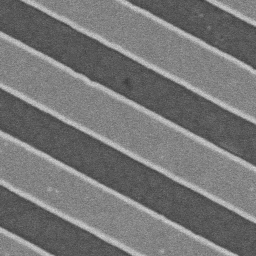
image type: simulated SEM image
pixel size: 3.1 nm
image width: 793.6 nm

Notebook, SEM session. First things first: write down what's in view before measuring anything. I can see one or a few lines or trenches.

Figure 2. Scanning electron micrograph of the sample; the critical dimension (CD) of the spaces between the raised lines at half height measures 0.131 um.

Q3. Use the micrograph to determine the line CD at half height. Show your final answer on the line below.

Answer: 140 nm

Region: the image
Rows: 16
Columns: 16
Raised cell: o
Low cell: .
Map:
...ooooo......oo
....oooooo......
o.....oooooo....
ooo.....oooooo..
oooo......oooooo
oooooo......oooo
..oooooo......oo
....oooooo......
......oooooo....
oo......oooooo..
oooo......oooooo
oooooo......oooo
..oooooo......oo
....oooooo.....o
......oooooo....
oo......oooooo..